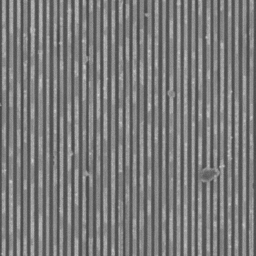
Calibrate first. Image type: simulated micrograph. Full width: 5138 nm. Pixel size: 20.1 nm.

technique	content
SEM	parallel lines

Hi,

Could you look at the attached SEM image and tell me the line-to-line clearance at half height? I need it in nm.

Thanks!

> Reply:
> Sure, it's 80.3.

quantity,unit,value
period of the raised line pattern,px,7.28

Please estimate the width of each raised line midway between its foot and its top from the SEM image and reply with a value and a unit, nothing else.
0.0602 micrometres